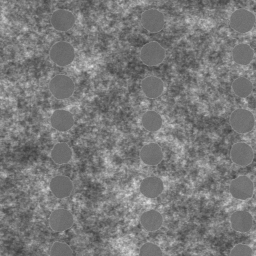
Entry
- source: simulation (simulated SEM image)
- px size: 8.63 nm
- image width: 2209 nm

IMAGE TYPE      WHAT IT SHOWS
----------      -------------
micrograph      a regular array of raised bodies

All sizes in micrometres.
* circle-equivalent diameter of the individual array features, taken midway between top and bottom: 0.206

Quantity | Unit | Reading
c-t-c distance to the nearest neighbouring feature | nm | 286